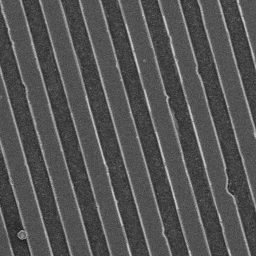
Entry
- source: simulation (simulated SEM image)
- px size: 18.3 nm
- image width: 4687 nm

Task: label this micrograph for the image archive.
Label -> parallel lines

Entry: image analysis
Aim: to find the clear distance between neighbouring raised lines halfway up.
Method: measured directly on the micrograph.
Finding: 17.9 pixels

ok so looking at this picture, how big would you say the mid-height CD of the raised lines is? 359 nm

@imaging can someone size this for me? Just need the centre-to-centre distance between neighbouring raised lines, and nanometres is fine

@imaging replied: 698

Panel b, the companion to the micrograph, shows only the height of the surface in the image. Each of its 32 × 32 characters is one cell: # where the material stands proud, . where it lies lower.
###..###..###..###..###..###..##
###..###..###..###..###..###..##
.##...##...##...##..###..###..##
.###..##...##...##...##...##...#
.###..###..###..###..###..###..#
..##...##..###..###..###..###..#
..##...##...##...##...##...##..#
..###..###..###..###..###..##...
..###..###..###..###..###..###..
...##...##..###..###..###..###..
#..##...##...##...##...##...##..
#..###..###..###..###..###..##..
#...##..###..###..###..###..###.
#...##...##...##...##...##...##.
##..###..###..###..##...##...##.
##..###..###..###..###..###..###
##...##...##...##..###..###..###
###..##...##...##...##...##...##
###..###..###..###..###..##...##
###..###..###..###..###..###..##
.##...##...##...##...##..###..##
.###..###..###..##...##...##...#
.###..###..###..###..###..##...#
..##...##...##...##..###..##...#
..###..##...##...##...##...##...
..###..###..###..###..###..###..
..###..###..###..###..###..###..
...##...##...##...##..###..###..
#..###..##...##...##...##...##..
#.####..###..###..###..###..###.
#...##...##..###..###..###..###.
##..##...##...##...##...##...##.